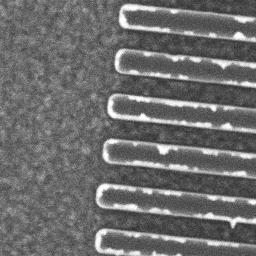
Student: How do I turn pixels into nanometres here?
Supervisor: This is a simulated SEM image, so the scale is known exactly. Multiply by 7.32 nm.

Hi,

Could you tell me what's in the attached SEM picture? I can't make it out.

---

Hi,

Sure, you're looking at parallel lines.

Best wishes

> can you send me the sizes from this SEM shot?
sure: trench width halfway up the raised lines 0.159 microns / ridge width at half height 172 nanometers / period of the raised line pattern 331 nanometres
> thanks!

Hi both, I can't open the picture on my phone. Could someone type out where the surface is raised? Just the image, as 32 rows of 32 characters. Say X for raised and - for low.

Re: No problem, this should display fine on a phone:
--------------------------------
---------------XXXXXXXXX--------
---------------XXXXXXXXXXXXXXXXX
----------------XXXXXXXXXXXXXXXX
-------------------------XXXXXXX
--------------------------------
---------------XXXX-------------
--------------XXXXXXXXXXXXX-----
---------------XXXXXXXXXXXXXXXXX
-------------------XXXXXXXXXXXXX
-----------------------------XXX
--------------------------------
--------------XXXXXXX-----------
--------------XXXXXXXXXXXXXXXX--
--------------XXXXXXXXXXXXXXXXXX
----------------------XXXXXXXXXX
--------------------------------
--------------------------------
-------------XXXXXXXXXXX--------
-------------XXXXXXXXXXXXXXXXXXX
---------------XXXXXXXXXXXXXXXXX
-------------------------XXXXXXX
--------------------------------
------------XXXXXX--------------
------------XXXXXXXXXXXXXXX-----
------------XXXXXXXXXXXXXXXXXXXX
-------------------XXXXXXXXXXXXX
----------------------------XXXX
--------------------------------
------------XXXXXXXXX-----------
------------XXXXXXXXXXXXXXXXXX--
-------------XXXXXXXXXXXXXXXXXXX